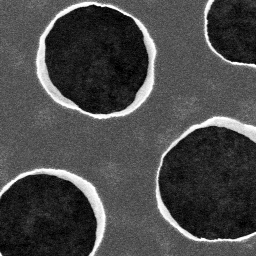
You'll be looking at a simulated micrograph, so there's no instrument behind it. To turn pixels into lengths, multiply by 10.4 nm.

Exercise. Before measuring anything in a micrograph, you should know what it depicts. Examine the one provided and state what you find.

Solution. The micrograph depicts holes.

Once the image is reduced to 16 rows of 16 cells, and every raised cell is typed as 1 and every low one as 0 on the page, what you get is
1111100111111000
1110000001111000
1110000001111000
1110000001111100
1110000001111111
1110000001111111
1111100011111111
1111111111111111
1111111111110000
1111111111000000
1111111111000000
1000011111000000
0000001111000000
0000001111100000
0000001111110000
0000001111111111